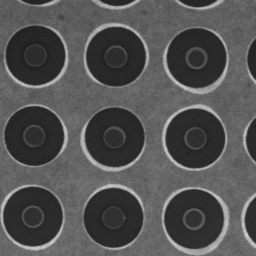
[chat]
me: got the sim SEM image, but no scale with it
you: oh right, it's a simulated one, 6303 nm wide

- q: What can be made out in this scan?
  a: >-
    an array of small figures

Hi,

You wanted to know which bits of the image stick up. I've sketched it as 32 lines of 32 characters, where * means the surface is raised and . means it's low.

***...*******...*******....*****
********************************
********************************
***...*******...********.*******
**.....****......*****.....*****
*.......***.......***.......***.
*..***..***..***..***...*...***.
*..***..***..***..***...**..***.
*.......***.......***.......***.
**.....****......****.......***.
***...*******...******.....*****
********************************
********************************
***...*******..*********..******
*......*****.....*****.....*****
*.......***.......***.......***.
*..**...**...**...***...*...***.
*..**...**...**...**...***..***.
*.......***.......***...*...***.
*......****......****.......***.
***...******....******.....*****
********************************
********************************
***..********...********.*******
*......****......*****.....*****
*.......***.......***.......***.
...**...***..**...**....*...***.
...**...**...**...**...**...**..
*.......***...*...***.......***.
*......****......****.......***.
**....******....******.....*****
************************.*******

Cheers